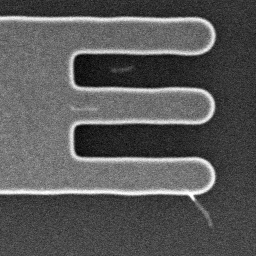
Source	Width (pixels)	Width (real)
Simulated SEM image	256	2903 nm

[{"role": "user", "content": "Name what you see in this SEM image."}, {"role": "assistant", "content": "groups of lines, slits or small figures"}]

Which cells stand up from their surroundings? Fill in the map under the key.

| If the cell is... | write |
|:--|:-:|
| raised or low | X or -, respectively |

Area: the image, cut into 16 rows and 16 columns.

----------------
XXXXXXXXXXXXX---
XXXXXXXXXXXXX---
XXXXX-----------
XXXXX-----------
XXXXXX----------
XXXXXXXXXXXXX---
XXXXXXXXXXXXX---
XXXXX-----------
XXXXX-----------
XXXXXXXXXXXXX---
XXXXXXXXXXXXX---
----------------
----------------
----------------
----------------